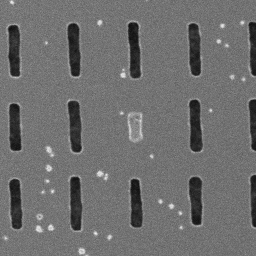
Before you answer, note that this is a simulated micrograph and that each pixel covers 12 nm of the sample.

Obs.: a regular array of holes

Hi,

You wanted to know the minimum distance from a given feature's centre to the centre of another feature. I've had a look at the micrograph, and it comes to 60.1 pixels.